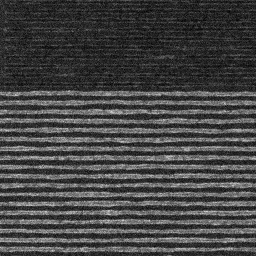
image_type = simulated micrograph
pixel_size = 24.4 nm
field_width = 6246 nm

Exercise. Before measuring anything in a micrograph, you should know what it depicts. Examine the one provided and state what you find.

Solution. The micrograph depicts parallel lines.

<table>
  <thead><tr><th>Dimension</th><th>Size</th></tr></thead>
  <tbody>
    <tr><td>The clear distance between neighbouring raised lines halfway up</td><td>146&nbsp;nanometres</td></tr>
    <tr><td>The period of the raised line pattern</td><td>223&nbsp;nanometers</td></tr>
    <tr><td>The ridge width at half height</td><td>73.2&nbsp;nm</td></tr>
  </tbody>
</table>